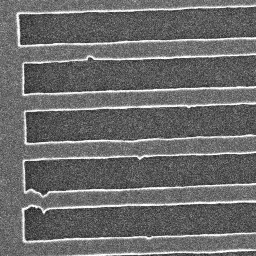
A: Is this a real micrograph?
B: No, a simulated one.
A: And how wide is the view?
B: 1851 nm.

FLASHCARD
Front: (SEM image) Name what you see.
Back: parallel lines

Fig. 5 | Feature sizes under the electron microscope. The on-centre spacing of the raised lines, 353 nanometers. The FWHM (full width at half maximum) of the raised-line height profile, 127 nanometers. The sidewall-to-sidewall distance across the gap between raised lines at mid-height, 0.229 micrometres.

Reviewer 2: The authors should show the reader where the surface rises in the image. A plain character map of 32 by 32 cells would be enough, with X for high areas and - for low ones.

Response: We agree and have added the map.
XXXXXXXXXXXXXXXXXXXXXXXXXXXXXXXX
XXXXXXXXX-X---------------------
XX------------------------------
XX------------------------------
XX------------------------------
XXX----XX-XXXXXXXXXXXXXXXXXXXXXX
XXXXXXXXXXXXXXXXXXXXXXXXXXXXXXXX
XXXXXXXXXX----------------------
XXX-----------------------------
XXX-----------------------------
XXX-----------------------------
XXX---------XXXXXXXXXXXXXXXXXXXX
XXXXXXXXXXXXXXXXXXXXXXXXXXXXXXXX
XXXXXXXXXXXXX-X-----------------
XXX-----------------------------
XXX-----------------------------
XXX-----------------------------
XXX--------------XXXXXXXXXXXXXXX
XXXXXXXXXXXXXXXXXXXXXXXXXXXXXXXX
XXXXXXXXXXXXXXXXXXXX------------
XXX-----------------------------
XXX-----------------------------
XXX-----------------------------
XXX----------------XXXXXXXXXXXXX
XXXXXXXXXXXXXXXXXXXXXXXXXXXXXXXX
XXXXXXXXXXXXXXXXXXXXXX----------
XXX-----------------------------
XXX-----------------------------
XXX-----------------------------
XXX---------------------XXXXXXXX
XXXXXXXXXXXXXXXXXXXXXXXXXXXXXXXX
XXXXXXXXXXXXXXXXXXXXXXXXXXX-----